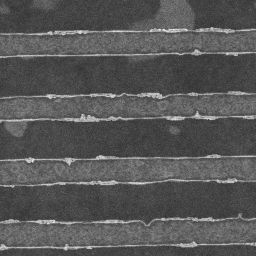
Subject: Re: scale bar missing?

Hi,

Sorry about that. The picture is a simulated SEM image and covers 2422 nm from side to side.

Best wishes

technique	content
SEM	one or a few lines or trenches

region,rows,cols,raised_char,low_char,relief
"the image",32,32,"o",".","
oooooooooooooooooooooooooooooooo
oooooooooooooooooooooooooooooooo
oooooooooooooooooooooooooooooooo
oooooooooooooooooooooooooooooooo
................................
................................
........................o.......
oooooooooooooooooooooooooooooooo
oooooooooooooooooooooooooooooooo
oooooooooooooooooooooooooooooooo
oooooooooooooooooooooooooooooooo
oooooooooooooooooooooooooooooooo
................................
................................
..........o.............o.......
oooooooooooooooooooooooooooooooo
oooooooooooooooooooooooooooooooo
oooooooooooooooooooooooooooooooo
oooooooooooooooooooooooooooooooo
ooooooooooooooooooooooooooooooo.
................................
................................
.....................oo.....oo..
oooooooooooooooooooooooooooooooo
oooooooooooooooooooooooooooooooo
oooooooooooooooooooooooooooooooo
oooooooooooooooooooooooooooooooo
ooooooooooooooooooooo...oooo....
................................
................................
........................o......o
oooooooooooooooooooooooooooooooo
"